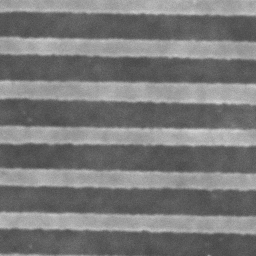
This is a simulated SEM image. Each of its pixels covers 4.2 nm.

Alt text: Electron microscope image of lines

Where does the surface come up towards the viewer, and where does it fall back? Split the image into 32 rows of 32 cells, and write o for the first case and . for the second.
oooooooooooooooooooooooooooooooo
.........ooooooooooooooooooooooo
................................
................................
................................
oooooooooooooooooooooooooooooooo
oooooooooooooooooooooooooooooooo
................................
................................
................................
oooooooooooooooooooooooooo.o....
oooooooooooooooooooooooooooooooo
...........o.ooooooooooooooooooo
................................
................................
................................
oooooooooooooooooooooooooooooooo
oooooooooooooooooooooooooooooooo
................................
................................
................................
oooooooooooooooooooo............
oooooooooooooooooooooooooooooooo
..............oooooooooooooooooo
................................
................................
................................
oooooooooooooooooooooooooooooooo
oooooooooooooooooooooooooooooooo
................................
................................
................................